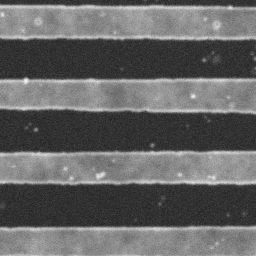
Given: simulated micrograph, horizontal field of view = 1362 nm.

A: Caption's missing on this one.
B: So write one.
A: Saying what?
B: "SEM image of lines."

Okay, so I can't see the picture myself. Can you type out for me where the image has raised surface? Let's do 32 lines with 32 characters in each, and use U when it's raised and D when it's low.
DDDDDDDDDDDDDDDDDDDDDDDDDDDDDDDD
UUUUUUUUUUUUUUUUUUUUUUUUUUUUUUUU
UUUUUUUUUUUUUUUUUUUUUUUUUUUUUUUU
UUUUUUUUUUUUUUUUUUUUUUUUUUUUUUUU
UUUUUUUUUUUUUUUUUUUUUUUUUUUUUUUU
DDDDDDDDDDDDDDDDDDDDDDDDDDDDDDDD
DDDDDDDDDDDDDDDDDDDDDDDDDDDDDDDD
DDDDDDDDDDDDDDDDDDDDDDDDDDDDDDDD
DDDDDDDDDDDDDDDDDDDDDDDDDDDDDDDD
DDDDDDDDDDDDDDDDDDDDDDDDDDDDDDDD
UUUUUUUUUUUUUUUUUUUUUUUUUUUUUUUU
UUUUUUUUUUUUUUUUUUUUUUUUUUUUUUUU
UUUUUUUUUUUUUUUUUUUUUUUUUUUUUUUU
UUUUUUUUUUUUUUUUUUUUUUUUUUUUUUUU
DDDDDDDDDDDDDDDDDDDDDDDDDDDDDDDD
DDDDDDDDDDDDDDDDDDDDDDDDDDDDDDDD
DDDDDDDDDDDDDDDDDDDDDDDDDDDDDDDD
DDDDDDDDDDDDDDDDDDDDDDDDDDDDDDDD
DDDDDDDDDDDDDDDDDDDDDDDDDDDDDDDD
UUUUUUUUUUUUUUUUUUUUUUUUUUUUUUUU
UUUUUUUUUUUUUUUUUUUUUUUUUUUUUUUU
UUUUUUUUUUUUUUUUUUUUUUUUUUUUUUUU
UUUUUUUUUUUUUUUUUUUUUUUUUUUUUUUU
DDDDDDDDDDDDDDDDDDDDDDDDDDDDDDDD
DDDDDDDDDDDDDDDDDDDDDDDDDDDDDDDD
DDDDDDDDDDDDDDDDDDDDDDDDDDDDDDDD
DDDDDDDDDDDDDDDDDDDDDDDDDDDDDDDD
DDDDDDDDDDDDDDDDDDDDDDDDDDDDDDDD
DDDDDDDDDDDDDDDUDDDDDDDUUUUUUUUU
UUUUUUUUUUUUUUUUUUUUUUUUUUUUUUUU
UUUUUUUUUUUUUUUUUUUUUUUUUUUUUUUU
UUUUUUUUUUUUUUUUUUUUUUUUUUUUUUUU